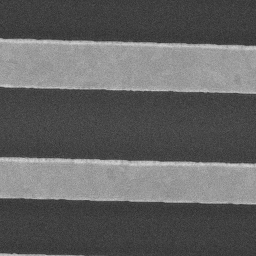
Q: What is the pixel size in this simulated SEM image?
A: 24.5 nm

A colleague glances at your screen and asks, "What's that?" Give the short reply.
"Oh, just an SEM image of lines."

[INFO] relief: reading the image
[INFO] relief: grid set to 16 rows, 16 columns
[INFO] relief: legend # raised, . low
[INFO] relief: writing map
................
................
#...............
################
################
....############
................
................
................
................
################
################
.....###########
................
................
................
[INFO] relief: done